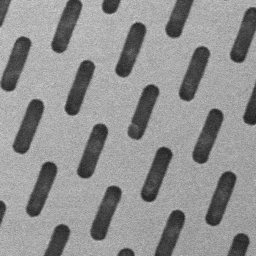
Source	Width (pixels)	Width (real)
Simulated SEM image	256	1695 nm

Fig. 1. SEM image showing a regular array of holes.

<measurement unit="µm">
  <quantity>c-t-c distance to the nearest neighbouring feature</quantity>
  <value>0.422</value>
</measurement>